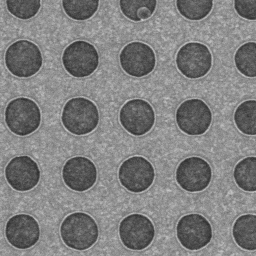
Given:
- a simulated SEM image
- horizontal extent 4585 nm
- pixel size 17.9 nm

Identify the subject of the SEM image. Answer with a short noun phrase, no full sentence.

a regular array of holes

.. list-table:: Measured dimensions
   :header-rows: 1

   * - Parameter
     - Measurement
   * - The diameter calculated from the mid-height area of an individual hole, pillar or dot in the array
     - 36.4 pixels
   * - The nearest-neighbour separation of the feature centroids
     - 1020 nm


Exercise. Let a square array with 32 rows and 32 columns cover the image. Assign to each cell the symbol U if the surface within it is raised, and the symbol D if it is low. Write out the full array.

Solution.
UDDDDUUUDDDDUUUDDDDDUUDDDDDUUDDD
UDDDDUUUDDDDUUUDDDDUUUDDDDUUUUDD
UUUUUUUUUDDUUUUUDDUUUUUUDUUUUUUD
UUUUUUUUUUUUUUUUUUUUUUUUUUUUUUUU
UUUUUUUUUUUUUUUUUUUUUUUUUUUUUUUU
UUDDUUUUUDDUUUUUDDUUUUUDDUUUUUUD
UDDDDUUUDDDDUUUDDDDUUUDDDDUUUDDD
UDDDDUUUDDDDUUUDDDDUUUDDDDDUUDDD
UDDDDUUUDDDDUUUDDDDUUUDDDDUUUUDD
UUDDUUUUUDDUUUUUUDUUUUUDDUUUUUUD
UUUUUUUUUUUUUUUUUUUUUUUUUUUUUUUU
UUUUUUUUUUUUUUUUUUUUUUUUUUUUUUUU
UUDDUUUUUDDUUUUUDDUUUUUDDUUUUUUD
UDDDDUUUDDDDUUUDDDDUUUDDDDUUUUDD
UDDDDUUUDDDDUUUDDDDUUUDDDDUUUDDD
UDDDDUUUDDDDUUUDDDDUUUDDDDUUUDDD
UUDDUUUUUDDUUUUUDDUUUUUDDDUUUUDD
UUUUUUUUUUUUUUUUUUUUUUUUUUUUUUUU
UUUUUUUUUUUUUUUUUUUUUUUUUUUUUUUU
UUUUUUUUUUUUUUUUUUUUUUUUUUUUUUUU
UDDDDUUUDDDDUUUDDDDUUUDDDDUUUUDD
UDDDDUUUDDDDUUUDDDDUUUDDDDUUUDDD
UDDDDUUUDDDDUUUDDDDUUUDDDDUUUDDD
UUDDUUUUUDDUUUUUDDDUUUUDDDUUUUDD
UUUUUUUUUUUUUUUUUUUUUUUUUUUUUUUU
UUUUUUUUUUUUUUUUUUUUUUUUUUUUUUUU
UUUUUUUUUUUUUUUUUUUUUUUUUUUUUUUU
UDDDUUUUDDDDUUUDDDDUUUDDDDUUUUDD
UDDDDUUUDDDDUUUDDDDUUUDDDDUUUDDD
UDDDDUUUDDDDUUUDDDDUUUDDDDUUUDDD
UDDDUUUUDDDDUUUDDDDUUUUDDDUUUUDD
UUUUUUUUUUUUUUUUUUUUUUUUUUUUUUUU